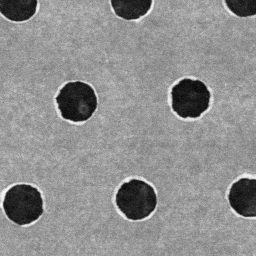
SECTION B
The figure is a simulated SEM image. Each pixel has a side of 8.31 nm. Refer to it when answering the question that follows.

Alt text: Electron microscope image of holes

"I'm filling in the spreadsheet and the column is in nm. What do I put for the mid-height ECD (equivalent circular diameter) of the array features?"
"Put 342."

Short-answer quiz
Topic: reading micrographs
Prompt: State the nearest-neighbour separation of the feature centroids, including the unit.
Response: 113 px